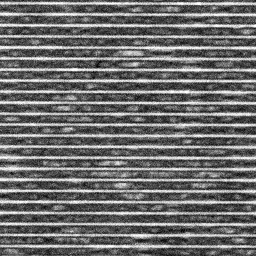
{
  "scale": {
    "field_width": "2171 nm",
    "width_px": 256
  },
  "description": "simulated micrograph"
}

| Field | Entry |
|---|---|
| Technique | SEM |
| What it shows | parallel lines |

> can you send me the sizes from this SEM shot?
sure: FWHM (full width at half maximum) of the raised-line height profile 14.8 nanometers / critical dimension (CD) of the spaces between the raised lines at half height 76.3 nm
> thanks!